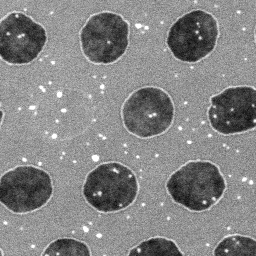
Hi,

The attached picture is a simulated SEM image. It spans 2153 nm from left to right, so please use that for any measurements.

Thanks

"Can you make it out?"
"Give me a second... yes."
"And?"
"raised bodies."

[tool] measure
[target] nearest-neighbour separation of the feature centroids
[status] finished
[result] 0.724 microns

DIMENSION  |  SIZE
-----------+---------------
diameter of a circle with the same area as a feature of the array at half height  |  441 nm